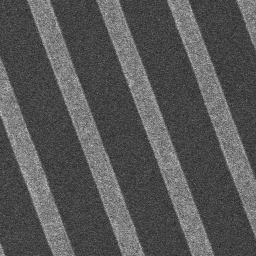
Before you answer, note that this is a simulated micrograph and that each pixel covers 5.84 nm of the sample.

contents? one or a few lines or trenches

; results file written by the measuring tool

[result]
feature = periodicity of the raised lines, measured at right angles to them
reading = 65.3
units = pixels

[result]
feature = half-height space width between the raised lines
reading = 272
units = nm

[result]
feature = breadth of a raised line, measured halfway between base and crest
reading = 110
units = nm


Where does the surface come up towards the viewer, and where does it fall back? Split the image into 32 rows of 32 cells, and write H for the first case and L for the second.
LLLLHHLLLLLLHHHLLLLLLHHHLLLLLLHH
LLLLHHHLLLLLLHHLLLLLLLHHLLLLLLHH
LLLLLHHLLLLLLHHHLLLLLLHHLLLLLLLH
LLLLLHHLLLLLLHHHLLLLLLHHHLLLLLLH
LLLLLHHHLLLLLLHHLLLLLLLHHLLLLLLH
LLLLLLHHLLLLLLHHHLLLLLLHHLLLLLLL
LLLLLLHHLLLLLLLHHLLLLLLHHHLLLLLL
LLLLLLHHHLLLLLLHHLLLLLLLHHLLLLLL
LLLLLLLHHLLLLLLHHHLLLLLLHHHLLLLL
HLLLLLLHHHLLLLLLHHLLLLLLLHHLLLLL
HLLLLLLLHHLLLLLLHHHLLLLLLHHLLLLL
HHLLLLLLHHLLLLLLHHHLLLLLLHHHLLLL
HHLLLLLLHHHLLLLLLHHLLLLLLLHHLLLL
HHLLLLLLLHHLLLLLLHHHLLLLLLHHLLLL
HHHLLLLLLHHLLLLLLLHHLLLLLLHHHLLL
LHHLLLLLLHHHLLLLLLHHLLLLLLLHHLLL
LHHLLLLLLLHHLLLLLLHHHLLLLLLHHHLL
LHHHLLLLLLHHHLLLLLLHHLLLLLLHHHLL
LLHHLLLLLLHHHLLLLLLHHHLLLLLLHHLL
LLHHHLLLLLLHHLLLLLLHHHLLLLLLHHHL
LLHHHLLLLLLHHHLLLLLLHHLLLLLLLHHL
LLLHHLLLLLLLHHLLLLLLHHHLLLLLLHHL
LLLHHHLLLLLLHHLLLLLLLHHLLLLLLHHH
LLLLHHLLLLLLHHHLLLLLLHHLLLLLLLHH
LLLLHHLLLLLLLHHLLLLLLHHHLLLLLLHH
LLLLHHHLLLLLLHHHLLLLLLHHLLLLLLHH
LLLLLHHLLLLLLHHHLLLLLLHHHLLLLLLH
LLLLLHHHLLLLLLHHLLLLLLHHHLLLLLLH
LLLLLLHHLLLLLLHHHLLLLLLHHLLLLLLL
LLLLLLHHLLLLLLLHHLLLLLLHHHLLLLLL
LLLLLLHHHLLLLLLHHLLLLLLLHHLLLLLL
LLLLLLLHHLLLLLLHHHLLLLLLHHLLLLLL